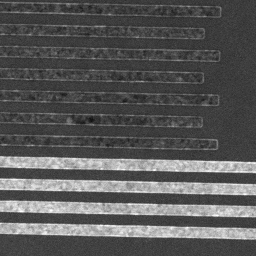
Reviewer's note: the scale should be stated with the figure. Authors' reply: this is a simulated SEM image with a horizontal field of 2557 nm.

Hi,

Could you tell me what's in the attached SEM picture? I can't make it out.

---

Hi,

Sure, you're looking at groups of lines, slits or small figures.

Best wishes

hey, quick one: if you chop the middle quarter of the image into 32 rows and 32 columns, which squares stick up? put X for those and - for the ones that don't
--------------------------------
XX------------------------------
XXXXXXXXXXXXXXXXXXXXXXXXXXXXXXXX
XXXXXXXXXXXXXXXXXXXXXXXXXXXXXXXX
----------------------------XXXX
--------------------------------
--------------------------------
XXXXXXXXXXXXXXXXXXX-------------
XXXXXXXXXXXXXXXXXXXXXXXXXXXXXXXX
XXXXXXXXXXXXXXXXXXXXXXXXXXXXXXXX
--------------------------------
--------------------------------
--------------------------------
XXXXXXXXXXXXXXXXXXXXXXXXXXXXXXXX
XXXXXXXXXXXXXXXXXXXXXXXXXXXXXXXX
----------------------XXXXXXXXXX
--------------------------------
--------------------------------
XXXXXXXXXXXXXXXXXXX-------------
XXXXXXXXXXXXXXXXXXXXXXXXXXXXXXXX
----XXXXXXXXXXXXXXXXXXXXXXXXXXXX
--------------------------------
--------------------------------
--------------------------------
XXXXXXXXXXXXXXXXXXXXXXXXXXXXXXXX
XXXXXXXXXXXXXXXXXXXXXXXXXXXXXXXX
-----------------XXXXXXXXXXXXXXX
--------------------------------
--------------------------------
XXXXXXXXXXXXXXX-----------------
XXXXXXXXXXXXXXXXXXXXXXXXXXXXXXXX
XXXXXXXXXXXXXXXXXXXXXXXXXXXXXXXX